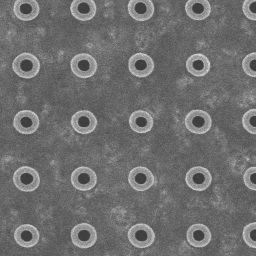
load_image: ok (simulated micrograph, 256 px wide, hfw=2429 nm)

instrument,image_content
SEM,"a regular array of ring-shaped raised bodies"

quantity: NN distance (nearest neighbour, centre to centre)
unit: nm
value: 536